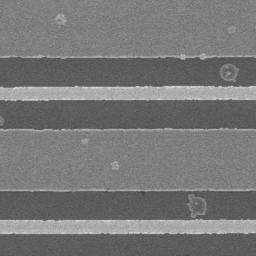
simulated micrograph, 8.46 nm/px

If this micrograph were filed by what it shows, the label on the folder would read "lines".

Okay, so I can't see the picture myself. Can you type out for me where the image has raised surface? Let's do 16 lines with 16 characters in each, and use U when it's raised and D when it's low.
UUUUUUUUUUUUUUUU
UUUUUUUUUUUUUUUU
UUUUUUUUUUUUUUUU
UUUUUUUUUUUUUUUU
DDDDDDDDDDDDDDUD
DDDDDDDDDDDDDDDD
DDDDDDDDDDDDDDDD
DDDDDDDDDDDDDDDD
UUUUUUUUUUUUUUUU
UUUUUUUUUUUUUUUU
UUUUUUUUUUUUUUUU
UUUUUUUUUUUUUUUU
DDDDDDDDDDDDDDDD
DDDDDDDDDDDDDDDD
DDDDDDDDDDDDDDDD
DDDDDDDDDDDDDDDD